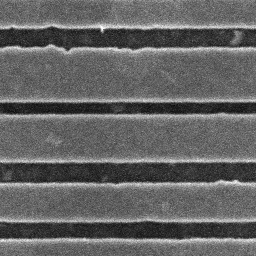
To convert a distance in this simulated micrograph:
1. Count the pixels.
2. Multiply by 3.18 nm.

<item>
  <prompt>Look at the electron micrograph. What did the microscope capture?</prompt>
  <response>one or a few lines or trenches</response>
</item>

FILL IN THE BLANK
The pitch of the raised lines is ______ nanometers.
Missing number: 203